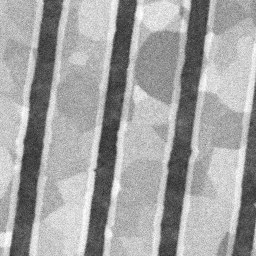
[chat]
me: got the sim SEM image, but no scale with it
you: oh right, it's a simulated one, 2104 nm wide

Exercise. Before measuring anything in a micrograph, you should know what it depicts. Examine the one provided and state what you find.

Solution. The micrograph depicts one or a few lines or trenches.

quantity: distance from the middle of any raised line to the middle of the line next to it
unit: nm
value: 601